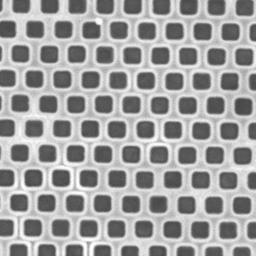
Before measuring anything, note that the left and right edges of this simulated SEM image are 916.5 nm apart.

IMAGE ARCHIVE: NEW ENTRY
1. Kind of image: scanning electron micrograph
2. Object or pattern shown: a regular array of holes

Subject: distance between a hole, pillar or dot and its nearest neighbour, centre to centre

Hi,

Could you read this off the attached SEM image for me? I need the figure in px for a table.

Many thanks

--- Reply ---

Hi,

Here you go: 27.6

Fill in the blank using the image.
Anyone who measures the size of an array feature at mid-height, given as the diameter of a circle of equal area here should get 0.0722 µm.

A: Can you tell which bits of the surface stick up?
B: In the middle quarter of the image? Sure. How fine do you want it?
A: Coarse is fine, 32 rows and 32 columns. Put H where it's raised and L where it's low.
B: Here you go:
HHHHHHHHHHHHHHHHHHHHHHHHHHHHHHLL
LHHHHHHHHHHHHHHHHHHHHHHHHHHHHHHH
LLHHLLLLLHHLLLLLHHLLLLLHHHLLLHHH
LLHHLLLLLHHLLLLLHHLLLLLHHLLLLLHH
LLHHLLLLLHHLLLLLHHLLLLLHHLLLLLHH
LLHHLLLLLHHLLLLLHHLLLLLHHLLLLLHH
HHHHHHHHHHHHLLLHHHHLLLHHHHLLLHHH
HHHHHHHHHHHHHHHHHHHHHHHHHHHHHHHH
HLLLLHHHLLLLHHHLLLLHHHLLLLHHHLLL
HLLLLHHHLLLLHHHLLLLHHLLLLLHHHLLL
HLLLLHHHLLLLHHHLLLLHHLLLLLHHHLLL
HLLLLHHHLLLLHHLLLLLHHHLLLLHHLLLL
HHHHHHHHHLLHHHHLLLHHHHHLLHHHHLLL
HHHHHHHHHHHHHHHHHHHHHHHHHHHHHHHH
LLHHLLLLLHHLLLLHHHLLLLHHHLLLLHHH
LLHHLLLLLHHLLLLLHHLLLLLHHLLLLLHH
LLHHLLLLLHHLLLLLHHLLLLLHHLLLLLHH
LLHHLLLLLHHLLLLLHHLLLLLHHLLLLLHH
LHHHHLLLHHHHLLLHHHHLLLHHHHLLLHHH
HHHHHHHHHHHHHHHHHHHHHHHHHHHHHHHH
HLLLLHHHLLLHHHHLLLHHHHLLLHHHHHHH
HLLLLHHLLLLLHHLLLLLHHLLLLLHHLLLL
LLLLLHHLLLLLHHLLLLLHHLLLLLHHLLLL
HLLLLHHLLLLLHHLLLLLHHLLLLLHHLLLL
HLLLLHHHLLLLHHHLLLLHHHLLLLHHHLLL
HHHHHHHHHHHHHHHHHHHHHHHHHHHHHHHH
LHHHLLLLHHHHLLHHHHHHHHHHHHLLHHHH
LLHHLLLLLHHLLLLLHHLLLLLHHLLLLHHH
LLHHLLLLLHHLLLLLHHLLLLLHHLLLLLHH
LLHHLLLLLHHLLLLLHHLLLLLHHLLLLLHH
LHHHLLLLHHHLLLLLHHLLLLHHHLLLLHHH
HHHHHHHHHHHHHHHHHHHHHHHHHHHHHHHH